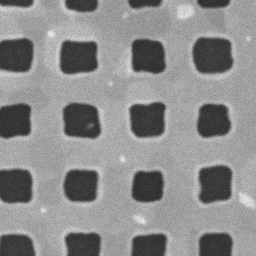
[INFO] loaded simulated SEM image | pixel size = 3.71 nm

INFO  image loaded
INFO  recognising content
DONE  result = a regular array of holes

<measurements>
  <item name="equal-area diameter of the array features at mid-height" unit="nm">144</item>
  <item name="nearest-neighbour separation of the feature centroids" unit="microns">0.238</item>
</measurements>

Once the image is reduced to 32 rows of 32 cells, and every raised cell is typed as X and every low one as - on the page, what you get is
----XXXX----XXXX----XXXXX----XXX
XXXXXXXXXX-XXXXXXXXXXXXXXXXXXXXX
XXXXXXXXXXXXXXXXXXXXXXXXXXXXXXXX
XXXXXXXXXXXXXXXXXXXXXXXXXXXXXXXX
XXXXXXXXXXXXXXXXXXXXXXXXXXXXXXXX
----XXXX----XXXX----XXXX-----XXX
----XXX-----XXXX-----XXX-----XXX
----XXX-----XXXX-----XXX-----XXX
----XXX-----XXXX-----XXX-----XXX
XXXXXXXXXXXXXXXXXXXXXXXXXXXXXXXX
XXXXXXXXXXXXXXXXXXXXXXXXXXXXXXXX
XXXXXXXXXXXXXXXXXXXXXXXXXXXXXXXX
XXXXXXXXXXXXXXXXXXXXXXXXXXXXXXXX
----XXXX----XXXX-----XXXX----XXX
----XXXX----XXXX-----XXXX----XXX
----XXXX-----XXX-----XXXX----XXX
----XXXX-----XXXX----XXXX----XXX
XXXXXXXXXXXXXXXXXXXXXXXXXXXXXXXX
XXXXXXXXXXXXXXXXXXXXXXXXXXXXXXXX
XXXXXXXXXXXXXXXXXXXXXXXXXXXXXXXX
XXXXXXXXXXXXXXXXXXXXXXXXXXX-XXXX
----XXXX----XXXXX---XXXXX----XXX
----XXXX----XXXXX----XXXX----XXX
----XXXX----XXXX-----XXXX----XXX
----XXXX----XXXXX---XXXXX----XXX
XXXXXXXXXXXXXXXXXXXXXXXXX-XXXXXX
XXXXXXXXXXXXXXXXXXXXXXXXXXXXXXXX
XXXXXXXXXXXXXXXXXXXXXXXXXXXXXXXX
XXXXXXXXXXXXXXXXXXXXXXXXXXXXXXXX
----XXXX----XXXXX----XXXX----XXX
----XXXX-----XXX-----XXXX----XXX
-----XXX-----XXX-----XXXX----XXX